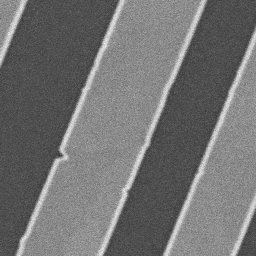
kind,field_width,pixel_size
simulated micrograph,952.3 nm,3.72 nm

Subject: one or a few lines or trenches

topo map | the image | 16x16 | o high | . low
o......oooooo...
o......ooooo....
.......ooooo....
......ooooo....o
......ooooo....o
.....ooooo.....o
.....ooooo....oo
.....ooooo....oo
....ooooo....ooo
....ooooo....ooo
...ooooo.....ooo
...ooooo....oooo
...ooooo....oooo
..ooooo....ooooo
..ooooo....oooo.
.ooooo.....oooo.